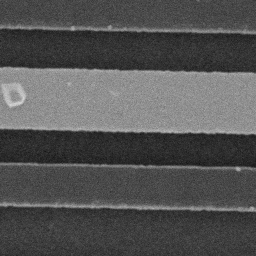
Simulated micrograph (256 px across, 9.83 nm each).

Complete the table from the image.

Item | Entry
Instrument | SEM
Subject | lines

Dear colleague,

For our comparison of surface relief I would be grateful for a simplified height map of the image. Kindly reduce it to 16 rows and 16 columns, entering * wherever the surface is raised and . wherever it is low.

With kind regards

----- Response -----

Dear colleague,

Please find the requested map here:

****************
****************
................
................
***********.....
****************
****************
****************
................
................
***************.
****************
****************
................
................
................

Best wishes